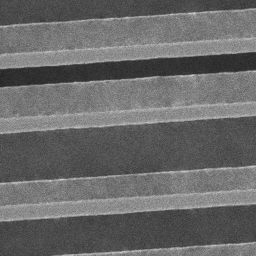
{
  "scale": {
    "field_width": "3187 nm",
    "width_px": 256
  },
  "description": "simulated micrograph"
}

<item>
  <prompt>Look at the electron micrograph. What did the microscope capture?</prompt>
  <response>lines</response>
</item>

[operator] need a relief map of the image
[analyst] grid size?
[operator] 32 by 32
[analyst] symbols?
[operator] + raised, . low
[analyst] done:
................................
.........................+++++++
...........+++++++++++++++++++++
++++++++++++++++++++++++++++++++
++++++++++++++++++++++++++++++++
++++++++++++++++++++++++++++++++
+++++++++++++++++++++++++++++++.
+++++++++++++++.................
+...............................
.....................+++++++++++
.......+++++++++++++++++++++++++
++++++++++++++++++++++++++++++++
++++++++++++++++++++++++++++++++
++++++++++++++++++++++++++++++++
+++++++++++++++++++++++++++++++.
++++++++++++++++................
++..............................
................................
................................
................................
................................
.....................+++++++++++
.......+++++++++++++++++++++++++
++++++++++++++++++++++++++++++++
++++++++++++++++++++++++++++++++
+++++++++++++++++++++++++++++++.
+++++++++++++++++...............
++..............................
................................
................................
..............................++
...............+++++++++++++++++